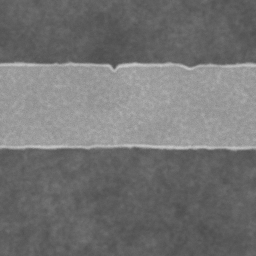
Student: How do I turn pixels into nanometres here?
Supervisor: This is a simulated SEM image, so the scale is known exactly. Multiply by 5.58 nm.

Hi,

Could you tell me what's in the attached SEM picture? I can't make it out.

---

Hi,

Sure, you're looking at one or a few lines or trenches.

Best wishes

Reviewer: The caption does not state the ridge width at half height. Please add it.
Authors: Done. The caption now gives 82 px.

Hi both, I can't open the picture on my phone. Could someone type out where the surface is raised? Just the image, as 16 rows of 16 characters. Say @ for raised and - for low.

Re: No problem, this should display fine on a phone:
----------------
----------------
----------------
----------------
@@@@@@@@@@@@@@@@
@@@@@@@@@@@@@@@@
@@@@@@@@@@@@@@@@
@@@@@@@@@@@@@@@@
@@@@@@@@@@@@@@@@
----------------
----------------
----------------
----------------
----------------
----------------
----------------